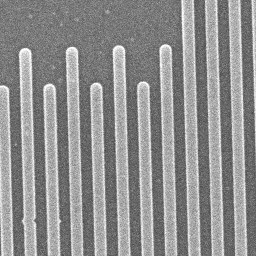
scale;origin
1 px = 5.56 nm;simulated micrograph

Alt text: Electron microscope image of parallel lines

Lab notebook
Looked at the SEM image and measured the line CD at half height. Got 63.2 nm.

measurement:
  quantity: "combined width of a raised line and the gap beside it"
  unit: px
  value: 23.4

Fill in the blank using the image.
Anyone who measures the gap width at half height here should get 68.8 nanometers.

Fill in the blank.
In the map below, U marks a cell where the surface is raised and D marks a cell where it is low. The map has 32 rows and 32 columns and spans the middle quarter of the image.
DUUDDDDDDDDDUUUDDDDDDDDDUUUDDDUU
DUUDDDDDDDDDUUUDDDDDDDDDUUUDDDUU
DUUUDDDDDDDDDUUDDDDDDDDDUUUDDDUU
DUUUDDDDDDDDDUUDDDDDDDDDUUUDDDUU
DUUUDDDDDDDDDUUDDDDDDDDDUUUDDDUU
DUUUDDDUUDDDDUUDDDDUUDDDUUUDDDUU
DUUUDDDUUDDDDUUDDDDUUDDDUUUDDDUU
DUUUDDDUUDDDDUUDDDDUUDDDUUUDDDUU
DUUUDDDUUDDDDUUDDDDUUDDDDUUDDDUU
DUUUDDDUUDDDDUUDDDDUUDDDDUUDDDUU
DUUUDDDUUDDDDUUDDDDUUDDDDUUDDDUU
DUUUDDDUUDDDDUUDDDDUUDDDDUUDDDUU
DUUUDDDUUDDDDUUDDDDUUDDDDUUDDDUU
DUUUDDDUUDDDDUUDDDDUUDDDDUUDDDUU
DUUUDDDUUUDDDUUDDDDUUDDDDUUDDDUU
DUUUDDDUUUDDDUUDDDDUUDDDDUUDDDUU
DUUUDDDUUUDDDUUDDDDUUDDDDUUDDDUU
DUUUDDDUUUDDDUUUDDDUUDDDDUUDDDUU
DUUUDDDUUUDDDUUUDDDUUDDDDUUDDDUU
DUUUDDDUUUDDDUUUDDDUUUDDDUUDDDDU
DUUUDDDUUUDDDUUUDDDUUUDDDUUDDDDU
DUUUDDDUUUDDDUUUDDDUUUDDDUUDDDDU
DUUUDDDUUUDDDUUUDDDUUUDDDUUDDDDU
DUUUDDDUUUDDDUUUDDDUUUDDDUUDDDDU
DUUUDDDUUUDDDUUUDDDUUUDDDUUDDDDU
DDUUDDDUUUDDDUUUDDDUUUDDDUUDDDDU
DDUUDDDUUUDDDUUUDDDUUUDDDUUDDDDU
DDUUDDDUUUDDDUUUDDDUUUDDDUUDDDDU
DDUUDDDUUUDDDUUUDDDUUUDDDUUDDDDU
DDUUDDDUUUDDDUUUDDDUUUDDDUUDDDDU
DDUUDDDUUUDDDUUUDDDUUUDDDUUDDDDU
DDUUDDDDUUDDDDUUDDDUUUDDDUUUDDDU